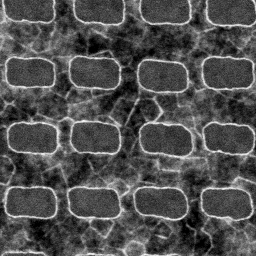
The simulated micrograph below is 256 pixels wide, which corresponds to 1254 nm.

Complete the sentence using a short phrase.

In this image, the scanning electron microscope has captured a regular array of raised bodies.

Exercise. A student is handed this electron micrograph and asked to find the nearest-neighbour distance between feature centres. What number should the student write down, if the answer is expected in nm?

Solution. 309